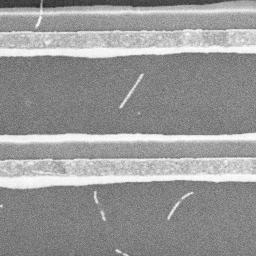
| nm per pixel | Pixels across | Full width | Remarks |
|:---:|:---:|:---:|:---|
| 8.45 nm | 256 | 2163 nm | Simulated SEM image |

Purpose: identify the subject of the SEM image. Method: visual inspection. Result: lines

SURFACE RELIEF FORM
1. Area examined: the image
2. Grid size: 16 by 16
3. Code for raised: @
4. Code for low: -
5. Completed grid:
--------------@@
@@@@@@@@@@@@@@@@
@@@@@@@@@@@@@@@@
----------------
----------------
----------------
----------------
----------------
----------------
@@@@@@@@@@@@@@@@
@@@@@@@@@@@@@@@@
----------------
----------------
----------------
----------------
----------------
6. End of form